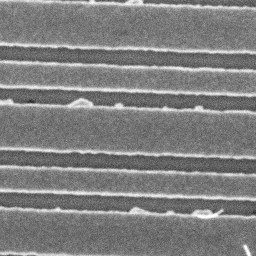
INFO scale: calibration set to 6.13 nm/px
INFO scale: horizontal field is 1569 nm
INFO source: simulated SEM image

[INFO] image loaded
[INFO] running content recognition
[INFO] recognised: lines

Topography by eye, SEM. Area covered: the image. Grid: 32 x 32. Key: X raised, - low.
XXXXXXXXXXXXXXXXXX--------------
XXXXXXXXXXXXXXXXXXXXXXXXXXXXXXXX
XXXXXXXXXXXXXXXXXXXXXXXXXXXXXXXX
XXXXXXXXXXXXXXXXXXXXXXXXXXXXXXXX
XXXXXXXXXXXXXXXXXXXXXXXXXXXXXXXX
XXXXXXXXXXXXXXXXXXXXXXXXXXXXXXXX
--------------------------XXXXXX
--------------------------------
XXXXXXXXXXXXXXXXXXXXXXX---------
XXXXXXXXXXXXXXXXXXXXXXXXXXXXXXXX
XXXXXXXXXXXXXXXXXXXXXXXXXXXXXXXX
-------------------XXXXXXXXXXXXX
--------------------------------
XXXXXXXXXXXXXXXXX---------------
XXXXXXXXXXXXXXXXXXXXXXXXXXXXXXXX
XXXXXXXXXXXXXXXXXXXXXXXXXXXXXXXX
XXXXXXXXXXXXXXXXXXXXXXXXXXXXXXXX
XXXXXXXXXXXXXXXXXXXXXXXXXXXXXXXX
XXXXXXXXXXXXXXXXXXXXXXXXXXXXXXXX
-----------------------XXXXXXXXX
--------------------------------
XXXXXXXXXXXXXXXXXXXXXX----------
XXXXXXXXXXXXXXXXXXXXXXXXXXXXXXXX
XXXXXXXXXXXXXXXXXXXXXXXXXXXXXXXX
-------------------XXXXXXXXXXXXX
--------------------------------
XXXXXXXXXXXXXXX-----------------
XXXXXXXXXXXXXXXXXXXXXXXXXXXXXXXX
XXXXXXXXXXXXXXXXXXXXXXXXXXXXXXXX
XXXXXXXXXXXXXXXXXXXXXXXXXXXXXXXX
XXXXXXXXXXXXXXXXXXXXXXXXXXXXXXXX
XXXXXXXXXXXXXXXXXXXXXXXXXXXXXXXX